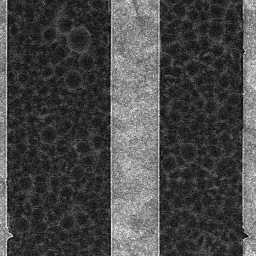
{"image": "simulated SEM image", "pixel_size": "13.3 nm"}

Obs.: one or a few lines or trenches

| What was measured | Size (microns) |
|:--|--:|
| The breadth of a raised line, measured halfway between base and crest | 0.633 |